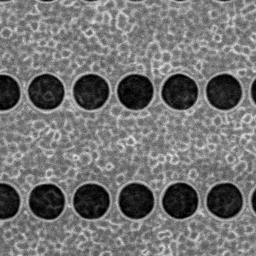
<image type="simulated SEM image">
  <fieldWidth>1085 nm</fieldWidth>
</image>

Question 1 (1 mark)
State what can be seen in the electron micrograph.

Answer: a regular array of holes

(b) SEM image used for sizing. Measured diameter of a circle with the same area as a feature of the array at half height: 0.158 um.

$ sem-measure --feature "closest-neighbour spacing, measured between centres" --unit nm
188